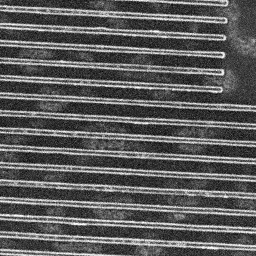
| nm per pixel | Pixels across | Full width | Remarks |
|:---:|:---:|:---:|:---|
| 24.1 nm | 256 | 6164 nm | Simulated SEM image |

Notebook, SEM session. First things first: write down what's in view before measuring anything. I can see parallel lines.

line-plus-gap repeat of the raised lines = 17.4 pixels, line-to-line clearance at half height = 319 nm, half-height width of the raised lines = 105 nanometres